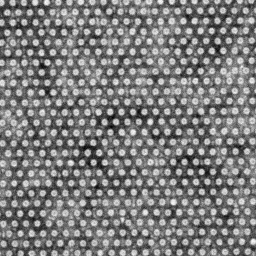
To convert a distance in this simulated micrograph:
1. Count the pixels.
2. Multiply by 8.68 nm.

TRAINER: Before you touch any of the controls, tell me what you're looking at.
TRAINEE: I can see a regular array of raised bodies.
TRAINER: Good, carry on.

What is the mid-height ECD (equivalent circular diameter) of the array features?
5.86 pixels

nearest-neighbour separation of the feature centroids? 96.7 nm